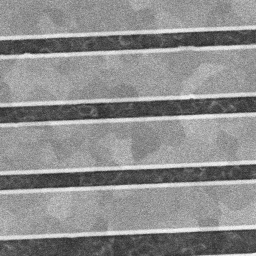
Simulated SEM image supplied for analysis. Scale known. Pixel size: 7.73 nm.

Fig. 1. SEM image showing one or a few lines or trenches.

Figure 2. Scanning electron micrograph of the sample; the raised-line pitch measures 0.517 um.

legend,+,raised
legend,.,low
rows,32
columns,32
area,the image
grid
++++++++++++++++++++++++++++++++
++++++++++++++++++++++++++++++++
++++++++++++++++++++++++++++++++
++++++++++++++++++++++++++++++..
++++++..........................
................................
...............+++++++++++++++++
++++++++++++++++++++++++++++++++
++++++++++++++++++++++++++++++++
++++++++++++++++++++++++++++++++
++++++++++++++++++++++++++++++++
++++++++++++++++++++++++++++++++
+++++++++++++++.................
................................
............................++++
.....+++++++++++++++++++++++++++
++++++++++++++++++++++++++++++++
++++++++++++++++++++++++++++++++
++++++++++++++++++++++++++++++++
++++++++++++++++++++++++++++++++
+++++++++++++++++++++++++.......
++..............................
................................
.............+++++++++++++++++++
++++++++++++++++++++++++++++++++
++++++++++++++++++++++++++++++++
++++++++++++++++++++++++++++++++
++++++++++++++++++++++++++++++++
++++++++++++++++++++++++++++....
+++++...........................
................................
................................